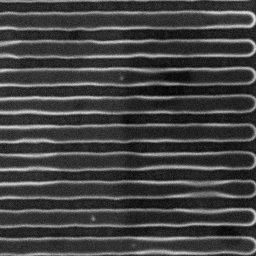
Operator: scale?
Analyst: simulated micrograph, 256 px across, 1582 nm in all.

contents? groups of lines, slits or small figures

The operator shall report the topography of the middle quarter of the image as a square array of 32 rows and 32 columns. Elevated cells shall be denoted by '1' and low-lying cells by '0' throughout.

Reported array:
00000000000000000000000000000000
11111111111111111100000000010111
11111111111111111111111111111111
11111111111111111111111111111111
11111111111111111111111111111111
00000000000000000000000000000000
00000000000000000000000000000000
00000000000000000000000000000000
01111111111111111111111111111111
11111111111111111111111111111111
11111111111111111111111111111111
11111111111111111111111111111111
00000000000000000000000000000000
00000000000000000000000000000000
00000000000000000000000000000000
00000111111111111111111111111111
11111111111111111111111111111111
11111111111111111111111111111111
11111111111111111111111111111111
11111100011001111000000000000000
00000000000000000000000000000000
00000000000000000000000000000000
11111111001111111110000000000000
11111111111111111111111111111111
11111111111111111111111111111111
11111111111111111111111111111111
11111000000000000000000000000000
00000000000000000000000000000000
00000000000000000000000000000000
11111111111111111111110000000000
11111111111111111111111111111111
11111111111111111111111111111111